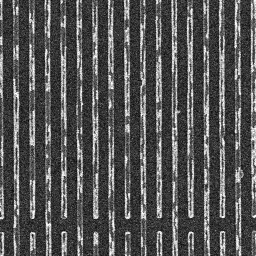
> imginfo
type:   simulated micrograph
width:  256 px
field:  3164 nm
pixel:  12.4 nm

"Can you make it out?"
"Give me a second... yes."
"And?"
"parallel lines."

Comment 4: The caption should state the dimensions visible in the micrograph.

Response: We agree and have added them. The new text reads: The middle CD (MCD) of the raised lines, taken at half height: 63.3 nanometres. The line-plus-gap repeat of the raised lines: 196 nm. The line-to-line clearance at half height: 10.9 px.